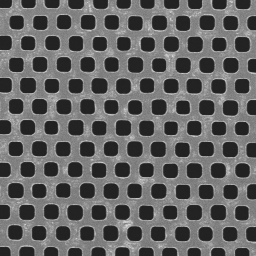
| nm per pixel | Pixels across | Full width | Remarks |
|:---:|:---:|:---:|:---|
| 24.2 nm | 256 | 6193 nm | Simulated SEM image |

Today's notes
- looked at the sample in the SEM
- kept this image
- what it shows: a regular array of holes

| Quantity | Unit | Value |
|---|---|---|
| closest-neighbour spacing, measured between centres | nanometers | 570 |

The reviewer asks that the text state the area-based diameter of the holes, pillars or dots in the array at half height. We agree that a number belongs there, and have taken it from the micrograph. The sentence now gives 384 nm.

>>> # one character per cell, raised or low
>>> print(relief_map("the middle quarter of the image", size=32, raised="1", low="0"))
00110000110000110000110000110000
00110000110000110000110001110000
11111111111111111111111111111111
11111111001111111111001111011111
10000110000110000110001110001110
10000110000110000110000110000100
10000110000110000110001110001110
11011111001111001111111111111111
11111111111111111111111111111111
00110000110001110001110001110001
00110000110000110000110000110000
00110000110000110000110000110000
01111001111001111001110001111001
11111111111111111111111111111111
10000111001110001110001110001110
10000110000110000110000110000110
10000110000110000110000110000110
10000110000110001110001110001110
11111111111111111111111111111111
01111001111001110001110001111111
00110000110001110000110000110000
00110000110000110000110000110000
00110000110001110001110001110001
11111111111111111111111111111111
11011111111111011111111111111111
10000110001110001110001110001110
10000110000110000110000110000110
10000110000110001110001110000110
11111111001111111111111111001111
11111111111111111111111111111111
00110001110000110001110000110001
00110000110000110000110000110000